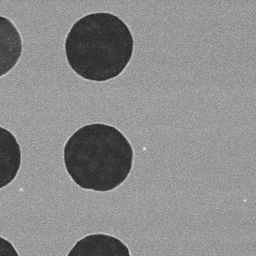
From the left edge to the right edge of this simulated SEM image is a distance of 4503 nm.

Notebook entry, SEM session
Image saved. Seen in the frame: holes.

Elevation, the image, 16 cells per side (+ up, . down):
++++++++++++++++
.++++...++++++++
.+++....++++++++
.+++....++++++++
+++++...++++++++
++++++++++++++++
++++++++++++++++
++++++++++++++++
.++++...++++++++
.+++....++++++++
.+++....++++++++
+++++..+++++++++
++++++++++++++++
++++++++++++++++
++++++++++++++++
.++++...++++++++